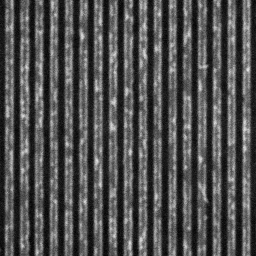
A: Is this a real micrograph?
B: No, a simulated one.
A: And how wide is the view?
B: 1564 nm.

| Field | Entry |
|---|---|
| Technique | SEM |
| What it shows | parallel lines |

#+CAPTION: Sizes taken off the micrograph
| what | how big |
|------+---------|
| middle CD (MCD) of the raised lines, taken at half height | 48.1 nanometers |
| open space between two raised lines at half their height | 43.6 nm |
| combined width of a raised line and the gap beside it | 0.0907 µm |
